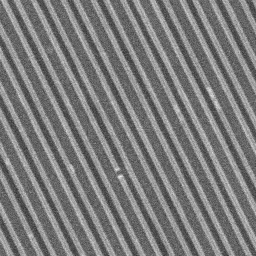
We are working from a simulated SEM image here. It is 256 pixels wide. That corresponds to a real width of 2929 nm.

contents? parallel lines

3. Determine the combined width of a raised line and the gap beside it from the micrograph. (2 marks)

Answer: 0.152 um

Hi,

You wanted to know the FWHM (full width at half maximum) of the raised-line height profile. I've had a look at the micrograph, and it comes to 0.0487 microns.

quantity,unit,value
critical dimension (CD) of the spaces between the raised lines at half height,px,7.85